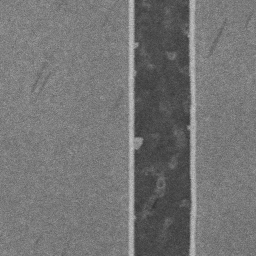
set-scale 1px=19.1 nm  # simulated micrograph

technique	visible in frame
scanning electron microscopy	one or a few lines or trenches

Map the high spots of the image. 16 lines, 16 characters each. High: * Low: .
********....****
********....****
********....****
********....****
********....****
********....****
********....****
********....****
********....****
********....****
********....****
********....****
********....****
********....****
********....****
********....****